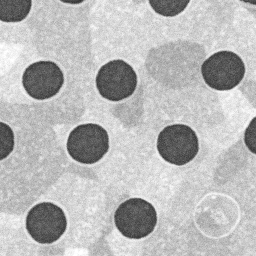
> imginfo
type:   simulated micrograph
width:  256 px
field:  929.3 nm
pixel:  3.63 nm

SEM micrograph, holes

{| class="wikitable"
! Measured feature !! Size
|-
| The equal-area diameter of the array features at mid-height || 156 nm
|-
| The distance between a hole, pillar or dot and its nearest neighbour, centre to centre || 309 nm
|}